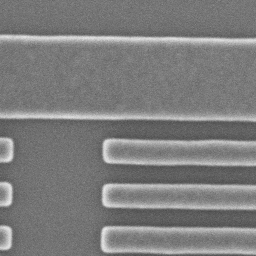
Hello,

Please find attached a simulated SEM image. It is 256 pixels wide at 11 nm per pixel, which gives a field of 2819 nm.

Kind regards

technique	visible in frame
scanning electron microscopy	wiring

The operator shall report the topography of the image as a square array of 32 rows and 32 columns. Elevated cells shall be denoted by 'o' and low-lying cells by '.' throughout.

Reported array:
................................
................................
................................
................................
ooo.............................
oooooooooooooooooooooooooooooooo
oooooooooooooooooooooooooooooooo
oooooooooooooooooooooooooooooooo
oooooooooooooooooooooooooooooooo
oooooooooooooooooooooooooooooooo
oooooooooooooooooooooooooooooooo
oooooooooooooooooooooooooooooooo
oooooooooooooooooooooooooooooooo
oooooooooooooooooooooooooooooooo
oooooooooooooooooooooooooooooooo
................................
................................
o.............o.................
oo...........ooooooooooooooooooo
oo...........ooooooooooooooooooo
..................oooooooooooooo
................................
................................
o............ooooooooooooooooooo
o............ooooooooooooooooooo
o............ooooooooooooooooooo
................................
................................
o............oooooo.............
o............ooooooooooooooooooo
o............ooooooooooooooooooo
.............ooooooooooooooooooo